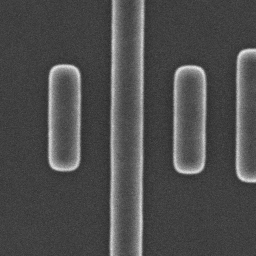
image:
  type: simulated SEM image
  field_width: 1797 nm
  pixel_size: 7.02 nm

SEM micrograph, groups of lines, slits or small figures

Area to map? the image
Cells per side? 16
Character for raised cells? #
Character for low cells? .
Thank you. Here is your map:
.......##.......
.......##.......
.......##.......
.......##......#
...##..##..##..#
...##..##..##..#
...##..##..##..#
...##..##..##..#
...##..##..##..#
...##..##..##..#
.......##..##..#
.......##.......
.......##.......
.......##.......
.......##.......
.......##.......